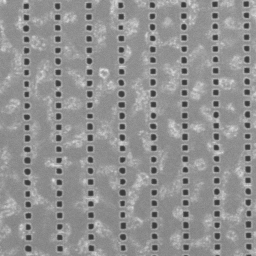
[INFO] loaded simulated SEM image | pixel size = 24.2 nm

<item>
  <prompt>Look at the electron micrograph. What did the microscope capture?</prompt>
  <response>a regular array of holes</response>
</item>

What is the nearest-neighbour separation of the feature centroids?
262 nm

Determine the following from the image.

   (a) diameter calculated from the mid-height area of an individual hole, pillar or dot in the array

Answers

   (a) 157 nanometers